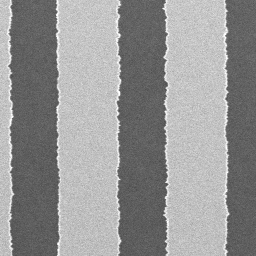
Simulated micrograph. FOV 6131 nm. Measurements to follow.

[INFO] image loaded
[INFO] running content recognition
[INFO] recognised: one or a few lines or trenches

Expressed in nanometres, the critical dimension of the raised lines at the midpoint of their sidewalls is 1420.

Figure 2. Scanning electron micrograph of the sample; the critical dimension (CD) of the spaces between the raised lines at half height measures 1160 nm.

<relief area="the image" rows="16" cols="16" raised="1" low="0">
1000111000111100
1000111000111100
1000111000111100
1000111000111100
1000111000111100
1000111000111100
1000111000111100
1000111000111100
1000111000111100
1000111000111100
1000111000111100
1000111000111100
1000111000111100
1000111000111100
1000111000111100
1000111000111100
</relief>